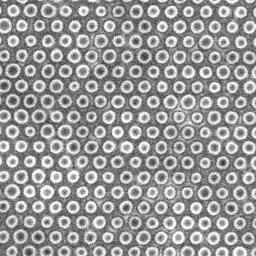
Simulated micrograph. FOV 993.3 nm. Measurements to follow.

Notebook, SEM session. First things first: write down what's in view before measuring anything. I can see a regular array of raised bodies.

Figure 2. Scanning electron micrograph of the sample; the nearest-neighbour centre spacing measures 0.0664 um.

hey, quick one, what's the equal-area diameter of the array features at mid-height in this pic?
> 44.5 nanometres